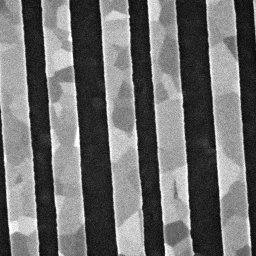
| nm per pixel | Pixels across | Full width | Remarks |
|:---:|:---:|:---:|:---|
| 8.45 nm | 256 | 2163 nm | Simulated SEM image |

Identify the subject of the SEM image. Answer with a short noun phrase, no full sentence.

parallel lines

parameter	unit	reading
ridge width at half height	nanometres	231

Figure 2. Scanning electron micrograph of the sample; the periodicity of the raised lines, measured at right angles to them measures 454 nm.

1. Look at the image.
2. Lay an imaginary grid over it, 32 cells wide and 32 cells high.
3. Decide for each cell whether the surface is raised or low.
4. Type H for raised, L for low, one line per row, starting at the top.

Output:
HHHLLHHHHLLLLHHHLLLHHHLLLLHHHLLL
HHHLLHHHHLLLLHHHLLLHHHLLLLHHHLLL
HHHLLHHHHLLLLHHHLLLHHHLLLLHHHLLL
HHHLLHHHHLLLLHHHLLLHHHLLLLHHHHLL
HHHLLHHHHLLLLHHHLLLHHHLLLLHHHHLL
HHHLLLHHHLLLLHHHLLLHHHLLLLHHHHLL
HHHLLLHHHLLLLHHHLLLHHHLLLLHHHHLL
HHHLLLHHHLLLLHHHLLLHHHLLLLHHHHLL
HHHLLLHHHLLLLHHHHLLHHHLLLLHHHHLL
HHHLLLHHHLLLLHHHLLLHHHHLLLHHHHLL
HHHLLLHHHLLLLHHHHLLHHHHLLLHHHHLL
HHHLLLHHHLLLLHHHHLLHHHHLLLHHHHLL
HHHLLLHHHHLLHHHHHLLHHHHLLLLHHHLL
HHHHLLHHHHLLHHHHHLLHHHHLLLLHHHLL
HHHHLLHHHHLLLHHHHLLHHHHLLLLHHHLL
HHHHLLHHHHLLLLHHHLLHHHHLLLLHHHLL
HHHHLLHHHHLLLLHHHLLLHHHLLLLHHHLL
HHHHLHHHHHLLLLHHHLLLHHHLLHLHHHLL
HHHHLLHHHHLLLLHHHLLLHHHLLHHHHHLL
LHHHLLLHHHLLLLHHHLLLHHHLLLLHHHHL
LHHHLLLHHHLLLLHHHLLLHHHLLLLHHHHL
LHHHLLLHHHLLLLHHHLLLHHHLLLLHHHHL
LHHHLLLHHHLLLLHHHHLLHHHLLLLHHHHL
LHHHLLLHHHLLLLHHHHLLHHHLLLLHHHHL
LHHHLHLHHHLLLLHHHHLLHHHHLLLLHHHL
LHHHLLLHHHLLLLHHHHLLHHHHLLLLHHHL
LHHHHLLHHHLLLLHHHHLLHHHHLLLLHHHL
LHHHHLLHHHHLLLHHHHLLHHHHLLLLHHHL
LHHHHLLHHHHLLLHHHHLLHHHHLLLLHHHL
LHHHHLLHHHHLLLLHHHLLHHHHLLLLHHHL
LHHHHLLHHHHLLLLHHHLLLHHHLLLLHHHL
LHHHHLLHHHHLLLLHHHLLLHHHLLLLHHHL